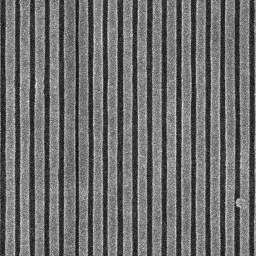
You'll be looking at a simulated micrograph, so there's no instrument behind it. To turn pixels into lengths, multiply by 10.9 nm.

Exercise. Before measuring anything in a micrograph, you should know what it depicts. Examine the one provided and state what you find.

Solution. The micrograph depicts parallel lines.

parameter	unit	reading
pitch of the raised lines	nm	159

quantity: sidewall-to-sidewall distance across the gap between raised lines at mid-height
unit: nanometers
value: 62.4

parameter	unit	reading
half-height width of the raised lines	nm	93.6